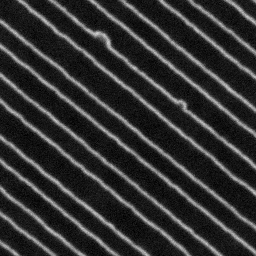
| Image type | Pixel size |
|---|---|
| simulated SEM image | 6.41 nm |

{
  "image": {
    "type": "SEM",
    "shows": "lines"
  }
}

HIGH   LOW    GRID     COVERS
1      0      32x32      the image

00011110000011110000111100000111
00001111000001111000001111000011
00000111110000111100000111100001
10000001111000001111000011110000
11000000111110000111100001111100
11110000011111000011110000011110
01111000001111100001111000001111
00111100000111110000111110000111
00011111000001111000011111000011
00000111100000111100000111100000
11000011110000011111000011110000
11100001111000001111100001111000
11110000111100000011110000111110
01111000011111000001111000001111
00111100000111100000111100000111
00011111000011110000011111000011
00000111100001111000001111100001
10000011110000111100000011110000
11000001111000001111000001111000
11100000111110000111100000111110
11110000011111000011110000011111
00111100000111100001111000001111
00011110000011110000011110000111
00001111000001111000001111000001
10000111100000111110000111100000
11100001111000001111000011110000
11110000111100000111100000111100
01111000011110000011110000011110
00111100001111000001111100001111
00011111000111100000011110000111
00000111100001111000001111000011
11000011110000111100000111100000